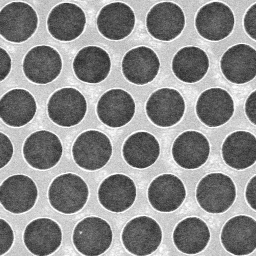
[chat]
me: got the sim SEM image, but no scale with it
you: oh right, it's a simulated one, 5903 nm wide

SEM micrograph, a regular array of holes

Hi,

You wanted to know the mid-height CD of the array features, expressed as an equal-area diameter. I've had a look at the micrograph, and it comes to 0.903 micrometres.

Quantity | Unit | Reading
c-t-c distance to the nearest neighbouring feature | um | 1.13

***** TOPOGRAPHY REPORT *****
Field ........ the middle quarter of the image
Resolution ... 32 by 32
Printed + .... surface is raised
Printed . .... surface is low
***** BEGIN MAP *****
++..........++..........+++.....
++..........++..........+++.....
+++........++++........++++.....
+++........++++........+++++....
+++++....+++++++......++++++++..
++++++++++++++++++++++++++++++++
...++++++++....++++++++.....++++
.....+++++......++++++.......+++
.....++++........++++.........++
......++..........+++.........++
......++..........++..........++
......++..........++..........++
.....+++..........+++.........++
.....++++........++++........+++
....+++++.......++++++.......+++
...++++++++....++++++++....+++++
++++++..++++++++++++++++++++++++
++++......+++++++.....+++++++...
+++........+++++.......+++++....
+++.........+++.........+++.....
++..........+++.........+++.....
++..........++..........+++.....
++..........++..........+++.....
++..........+++........++++.....
+++........++++........+++++....
++++......+++++++.....+++++++...
+++++....+++++++++++++++++++++++
...++++++++++.+++++++++++..+++++
....+++++++......++++++......+++
.....++++........+++++........++
......+++.........+++.........++
......++..........+++.........++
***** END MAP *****